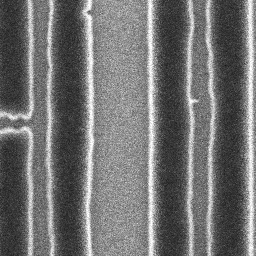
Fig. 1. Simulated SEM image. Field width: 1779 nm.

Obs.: one or a few lines or trenches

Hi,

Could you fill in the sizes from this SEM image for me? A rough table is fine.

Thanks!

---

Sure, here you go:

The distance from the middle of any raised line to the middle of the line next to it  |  558 nanometers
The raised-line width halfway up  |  287 nanometers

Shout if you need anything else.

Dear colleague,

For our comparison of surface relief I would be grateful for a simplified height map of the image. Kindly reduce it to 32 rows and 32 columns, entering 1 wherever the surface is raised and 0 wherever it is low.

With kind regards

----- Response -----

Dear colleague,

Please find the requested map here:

11110011111000000001111100111110
11110011111000000001111100111110
11110011111000000001111100111110
11110011111000000001111100111110
11110011111000000001111100111110
11110011111000000001111100111110
11110011111000000001111100111110
11110011111000000001111100111110
11110011111000000001111100111110
11110011111000000001111100111110
11110011111000000001111100111110
11110011111000000001111100111110
11110011111000000001111100011110
11110011111000000001111100011110
01110011111000000001111100011110
00000011111000000001111100011110
11110011111000000001111100011110
11110011111000000001111100111110
11110011111000000001111100111110
11110011111000000001111100111110
11110011111000000001111100111110
11110011111000000001111100111110
11110011111000000001111100111110
11110011111000000001111100111110
11110011111000000001111100111110
11110011111000000001111100111110
11110011111000000001111100111110
11110011111000000001111100111110
11110011111000000001111100111110
11110011111000000001111100111110
11110011111000000001111100111110
11110011111000000001111100111110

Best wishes